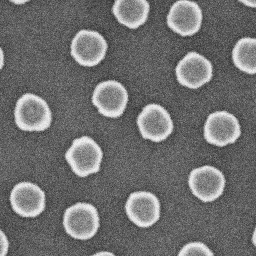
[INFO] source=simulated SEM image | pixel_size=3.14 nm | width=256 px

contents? a regular array of raised bodies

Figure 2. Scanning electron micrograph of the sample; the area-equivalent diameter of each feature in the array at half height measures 108 nm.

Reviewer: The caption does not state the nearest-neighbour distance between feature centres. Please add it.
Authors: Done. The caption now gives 182 nanometers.